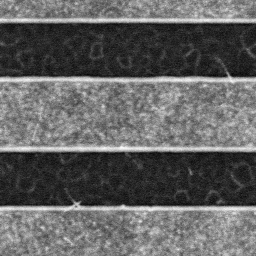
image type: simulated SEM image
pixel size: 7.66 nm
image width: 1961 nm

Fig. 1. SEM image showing one or a few lines or trenches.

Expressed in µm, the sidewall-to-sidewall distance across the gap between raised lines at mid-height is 0.439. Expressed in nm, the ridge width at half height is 546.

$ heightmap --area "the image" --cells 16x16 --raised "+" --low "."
++++++++++++++++
................
................
................
................
++++++++++++++++
++++++++++++++++
++++++++++++++++
++++++++++++++++
................
................
................
................
++++++++++++++++
++++++++++++++++
++++++++++++++++